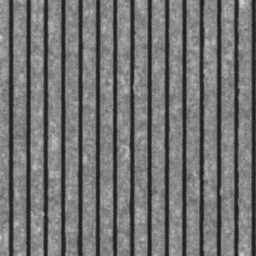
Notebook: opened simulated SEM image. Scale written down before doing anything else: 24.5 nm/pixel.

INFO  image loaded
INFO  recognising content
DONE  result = parallel lines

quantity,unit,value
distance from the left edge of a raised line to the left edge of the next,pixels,17.3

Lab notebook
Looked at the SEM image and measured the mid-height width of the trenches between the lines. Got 122 nm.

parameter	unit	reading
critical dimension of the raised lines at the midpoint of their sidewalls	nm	290